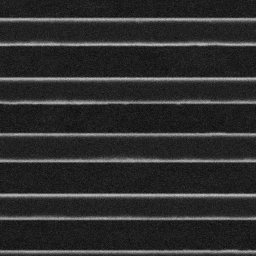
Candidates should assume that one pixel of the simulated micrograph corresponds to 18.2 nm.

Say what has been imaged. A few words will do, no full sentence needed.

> lines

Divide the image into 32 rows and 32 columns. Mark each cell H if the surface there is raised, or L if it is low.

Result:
LLLLLLLLLLLLLLLLLLLLLLLLLLLLLLLL
LLLLLLLLLLLLLLLLLLLLLLLLLLLLLLLL
HHHHHHHHHHHHHHHHHHHHHHHHHHHHHHHH
HHHHHHHHHHHHHHHHHHHHHHHHHHHHHHHH
HHHHHHHHHHHHHHHHHHHHHHHHHHHHHHHH
HHHHHHHHHHHHHHHHHHHHHHHHHHHHHHHH
LLLLLLLLLLLLLLLLLLLLLLLLLLLLLLLL
LLLLLLLLLLLLLLLLLLLLLLLLLLLLLLLL
LLLLLLLLLLLLLLLLLLLLLLLLLLLLLLLL
LLLLLLLLLLLLLLLLLLLLLLLLLLLLLLLL
HHHHHHHHHHHHHHHHHHHHHHHHHHHHHHHH
HHHHHHHHHHHHHHHHHHHHHHHHHHHHHHHH
HHHHHHHHHHHHHHHHHHHHHHHHHHHHHHHH
LLLLLLLLLLLLLLLLLLLLLLLLLLLLLLLL
LLLLLLLLLLLLLLLLLLLLLLLLLLLLLLLL
LLLLLLLLLLLLLLLLLLLLLLLLLLLLLLLL
LLLLLLLLLLLLLLLLLLLLLLLLLLLLLLLL
HHHHHHHHHHHHHHHHHHHHHHHHHHHHHHHH
HHHHHHHHHHHHHHHHHHHHHHHHHHHHHHHH
HHHHHHHHHHHHHHHHHHHHHHHHHHHHHHHH
LLLLLLLLLLLLLLLLLLLLLLLLLLLLLLLL
LLLLLLLLLLLLLLLLLLLLLLLLLLLLLLLL
LLLLLLLLLLLLLLLLLLLLLLLLLLLLLLLL
LLLLLLLLLLLLLLLLLLLLLLLLLLLLLLLL
HHHHHHHHHHHHHHHHHHHHHHHHHHHHHHHH
HHHHHHHHHHHHHHHHHHHHHHHHHHHHHHHH
HHHHHHHHHHHHHHHHHHHHHHHHHHHHHHHH
LLLLLLLLLLLLLLLLLLLLLLLLLLLLLLLL
LLLLLLLLLLLLLLLLLLLLLLLLLLLLLLLL
LLLLLLLLLLLLLLLLLLLLLLLLLLLLLLLL
LLLLLLLLLLLLLLLLLLLLLLLLLLLLLLLL
HHHHHHHHHHHHHHHHHHHHHHHHHHHHHHHH